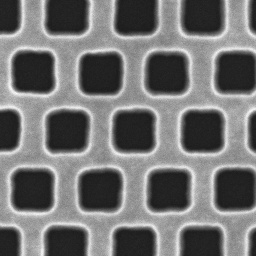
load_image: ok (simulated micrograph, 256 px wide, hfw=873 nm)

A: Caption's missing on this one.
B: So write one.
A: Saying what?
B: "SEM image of a regular array of holes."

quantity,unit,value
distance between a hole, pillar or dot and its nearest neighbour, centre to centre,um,0.231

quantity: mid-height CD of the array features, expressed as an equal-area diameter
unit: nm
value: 157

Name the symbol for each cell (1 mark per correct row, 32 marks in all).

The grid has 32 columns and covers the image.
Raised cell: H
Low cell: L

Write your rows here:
LLLHHHLLLLLHHHLLLLLLHHHLLLLLHHHL
LLLHHHLLLLLHHHLLLLLLHHHLLLLLHHHL
LLLHHHLLLLLHHHLLLLLLHHHLLLLLHHHL
LLHHHHLLLLLHHHLLLLLHHHHLLLLLHHHL
HHHHHHHHHHHHHHHHHHHHHHHHHHHHHHHH
HHHHHHHHHHHHHHHHHHHHHHHHHHHHHHHH
HHLLHHHHHHHHHHHHHHHHHLHHHHHHLLLH
HHLLLLLHHHLLLLLHHHHLLLLHHHHLLLLL
HLLLLLLHHHLLLLLHHHLLLLLLHHHLLLLL
HHLLLLLHHHLLLLLHHHLLLLLLHHHLLLLL
HHLLLLLHHHLLLLLHHHLLLLLLHHHLLLLL
HHHLLLHHHHLLLLLHHHHLLLLHHHHLLLLH
HHHHHHHHHHHHHHHHHHHHHHHHHHHHHHHH
HHHHHHHHHHHHHHHHHHHHHHHHHHHHHHHH
LLHHHHLLLLLHHHLLLLLHHHHLLLLLHHHL
LLLHHHLLLLLHHHLLLLLHHHHLLLLLHHHL
LLLHHHLLLLLHHHLLLLLHHHHLLLLLHHHL
LLHHHHLLLLLHHHLLLLLHHHHLLLLLHHHL
LLHHHHLLLLLHHHLLLLLHHHHLLLLLHHHL
HHHHHHHHHHHHHHHHHHHHHHHHHHHHHHHH
HHHHHHHHHHHHHHHHHHHHHHHHHHHHHHHH
HHLLLLHHHHHLLLLHHHHLLLLHHHHLLLLL
HLLLLLLHHHLLLLLHHHHLLLLLHHHLLLLL
HLLLLLLHHHLLLLLHHHLLLLLLHHHLLLLL
HLLLLLLHHHLLLLLHHHLLLLLLHHHLLLLL
HHLLLLLHHHLLLLLHHHLLLLLLHHHLLLLL
HHHHHHHHHHHLLLHHHHHHHHHHHHHHHHHH
HHHHHHHHHHHHHHHHHHHHHHHHHHHHHHHH
LHHHHHLLLLHHHHHLLLLHHHHLLLLHHHHH
LLLHHHLLLLLHHHLLLLLHHHHLLLLLHHHL
LLLHHHLLLLLHHHLLLLLLHHHLLLLLHHHL
LLLHHHLLLLLHHHLLLLLLHHHLLLLLHHHL